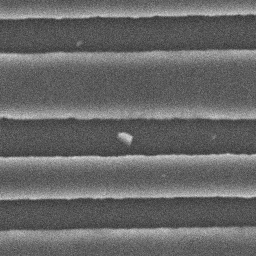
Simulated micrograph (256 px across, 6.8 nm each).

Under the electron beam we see lines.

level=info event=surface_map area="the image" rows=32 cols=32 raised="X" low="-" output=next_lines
XXXXXXXXXXXXXXXXXXXXXXXXXXXXXXXX
XXXXXXXXXXXXXXXXXXXXXXXXXXXXXXXX
--------------------------------
--------------------------------
--------------------------------
--------------------------------
--------------------------XXXXXX
XXXXXXXXXXXXXXXXXXXXXXXXXXXXXXXX
XXXXXXXXXXXXXXXXXXXXXXXXXXXXXXXX
XXXXXXXXXXXXXXXXXXXXXXXXXXXXXXXX
XXXXXXXXXXXXXXXXXXXXXXXXXXXXXXXX
XXXXXXXXXXXXXXXXXXXXXXXXXXXXXXXX
XXXXXXXXXXXXXXXXXXXXXXXXXXXXXXXX
XXXXXXXXXXXXXXXXXXXXXXXXXXXXXXXX
XXXXXXXXXXXXXXXXXXXXXXXXXXXXXXXX
--------------------------------
--------------------------------
--------------------------------
--------------------------------
----------------XX-XXXXXXXXXXXXX
XXXXXXXXXXXXXXXXXXXXXXXXXXXXXXXX
XXXXXXXXXXXXXXXXXXXXXXXXXXXXXXXX
XXXXXXXXXXXXXXXXXXXXXXXXXXXXXXXX
XXXXXXXXXXXXXXXXXXXXXXXXXXXXXXXX
XXXXXXXXXXXXXXXXXXXXXXXXXXXXXXXX
--------------------------------
--------------------------------
--------------------------------
--------------------------------
XXXXXXXXXXXXXXXXXXXXXXXXXXXXXXXX
XXXXXXXXXXXXXXXXXXXXXXXXXXXXXXXX
XXXXXXXXXXXXXXXXXXXXXXXXXXXXXXXX